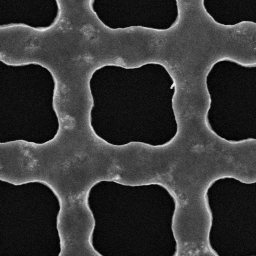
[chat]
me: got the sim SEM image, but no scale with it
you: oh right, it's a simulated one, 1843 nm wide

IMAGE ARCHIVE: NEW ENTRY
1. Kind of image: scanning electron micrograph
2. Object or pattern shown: holes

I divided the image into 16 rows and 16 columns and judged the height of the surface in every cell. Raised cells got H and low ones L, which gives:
LLLLHHLLLLLHHLLL
LLLHHHHLLLLHHHLH
HHHHHHHHHHHHHHHH
HHHHHHHHHHHHHHHH
LLLHHHLLLLHHHLLL
LLLHHHLLLLLHHLLL
LLLHHHLLLLLHHLLL
LLLLHHLLLLLHHLLL
LLLHHHLLLLLHHHLL
HHHHHHHHHHHHHHHH
HHHHHHHHHHHHHHHH
LLLHHHLLHHHHHLLL
LLLLHLLLLLLHHLLL
LLLLHHLLLLLHHLLL
LLLLHHLLLLLHHLLL
LLLLHHLLLLLHHLLL